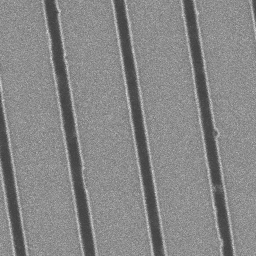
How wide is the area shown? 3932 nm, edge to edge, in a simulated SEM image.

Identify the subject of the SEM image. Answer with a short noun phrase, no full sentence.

one or a few lines or trenches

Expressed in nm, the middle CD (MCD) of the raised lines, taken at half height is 220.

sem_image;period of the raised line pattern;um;1.05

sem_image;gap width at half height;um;0.838